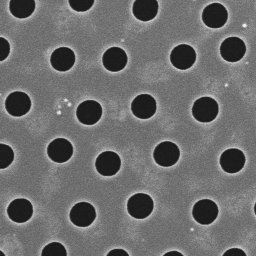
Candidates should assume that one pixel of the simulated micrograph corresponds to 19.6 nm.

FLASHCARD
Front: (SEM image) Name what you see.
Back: a regular array of holes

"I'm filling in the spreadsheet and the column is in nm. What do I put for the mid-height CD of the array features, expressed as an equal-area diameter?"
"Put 506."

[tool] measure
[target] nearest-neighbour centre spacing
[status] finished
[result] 1030 nm